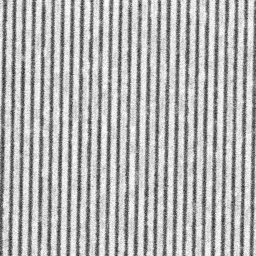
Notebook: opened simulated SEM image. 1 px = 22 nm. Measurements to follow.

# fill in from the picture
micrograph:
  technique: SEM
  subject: parallel lines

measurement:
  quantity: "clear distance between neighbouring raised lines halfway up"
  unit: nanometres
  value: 118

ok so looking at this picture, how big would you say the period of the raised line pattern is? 213 nanometers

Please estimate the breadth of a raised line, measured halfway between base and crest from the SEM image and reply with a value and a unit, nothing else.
99.1 nm